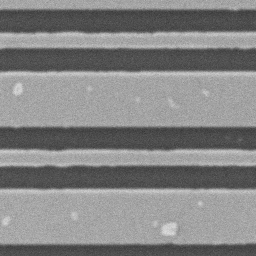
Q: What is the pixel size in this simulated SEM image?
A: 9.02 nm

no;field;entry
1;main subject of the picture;lines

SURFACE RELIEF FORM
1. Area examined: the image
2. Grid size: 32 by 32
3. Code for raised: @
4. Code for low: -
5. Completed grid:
@@@@@@@@@@@@@@@@@@@@@@@@@@@@@@@@
--------------------------------
--------------------------------
--------------------------------
@@@@@@@@@@@@@@@@@@@@@@@@@@@@@@@@
@@@@@@@@@@@@@@@@@@@@@@@@@@@@@@@@
--------------------------------
--------------------------------
--------------------------------
@@@@@@@@@@@@@@@@@@@@@@@@@@@@@@@@
@@@@@@@@@@@@@@@@@@@@@@@@@@@@@@@@
@@@@@@@@@@@@@@@@@@@@@@@@@@@@@@@@
@@@@@@@@@@@@@@@@@@@@@@@@@@@@@@@@
@@@@@@@@@@@@@@@@@@@@@@@@@@@@@@@@
@@@@@@@@@@@@@@@@@@@@@@@@@@@@@@@@
@@@@@@@@@@@@@@@@@@@@@@@@@@@@@@@@
--------------------------------
--------------------------------
--------------------------------
@@@@@@@@@@@@@@@@@@@@@@@@@@@@@@@@
@@@@@@@@@@@@@@@@@@@@@@@@@@@@@@@@
--------------------------------
--------------------------------
--------------------------------
@@@@@@@@@@@@@@@@@@@@@@@@@@@@@@@@
@@@@@@@@@@@@@@@@@@@@@@@@@@@@@@@@
@@@@@@@@@@@@@@@@@@@@@@@@@@@@@@@@
@@@@@@@@@@@@@@@@@@@@@@@@@@@@@@@@
@@@@@@@@@@@@@@@@@@@@@@@@@@@@@@@@
@@@@@@@@@@@@@@@@@@@@@@@@@@@@@@@@
@-------------------------------
--------------------------------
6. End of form